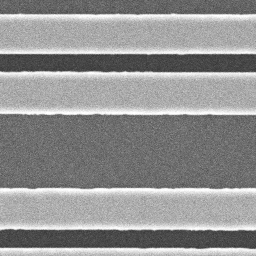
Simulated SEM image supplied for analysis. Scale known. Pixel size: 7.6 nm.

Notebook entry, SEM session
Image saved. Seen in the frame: lines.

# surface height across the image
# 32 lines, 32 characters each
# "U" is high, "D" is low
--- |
DDDDDDDDDDDDDDDDDDDDDDDDDDDDDDDD
DDDDDDDDDDDDDDDDDDDDDDDDDDDDDDDD
UUUUUUUUUUUUUUUUUUUUUUUUUUUUUUUU
UUUUUUUUUUUUUUUUUUUUUUUUUUUUUUUU
UUUUUUUUUUUUUUUUUUUUUUUUUUUUUUUU
UUUUUUUUUUUUUUUUUUUUUUUUUUUUUUUU
UUUUUUUUUUUUUUUUUUUUUUUUUUUUUUUU
DDDDDDDDDDDDDDDDDDDDDDDDDDDDDDDD
DDDDDDDDDDDDDDDDDDDDDDDDDDDDDDDD
UUUUUUUUUUUUUUUUUUUUUUUUUUUUUUUU
UUUUUUUUUUUUUUUUUUUUUUUUUUUUUUUU
UUUUUUUUUUUUUUUUUUUUUUUUUUUUUUUU
UUUUUUUUUUUUUUUUUUUUUUUUUUUUUUUU
UUUUUUUUUUUUUUUUUUUUUUUUUUUUUUUU
DDDDDDDDDDDDDDDDDDDDDDDDDDDDDDDD
DDDDDDDDDDDDDDDDDDDDDDDDDDDDDDDD
DDDDDDDDDDDDDDDDDDDDDDDDDDDDDDDD
DDDDDDDDDDDDDDDDDDDDDDDDDDDDDDDD
DDDDDDDDDDDDDDDDDDDDDDDDDDDDDDDD
DDDDDDDDDDDDDDDDDDDDDDDDDDDDDDDD
DDDDDDDDDDDDDDDDDDDDDDDDDDDDDDDD
DDDDDDDDDDDDDDDDDDDDDDDDDDDDDDDD
DDDDDDDDDDDDDDDDDDDDDDDDDDDDDDDD
DDDDDDDDDDDDDDDDDDDDDDDDDDDDDDDD
UUUUUUUUUUUUUUUUUUUUUUUUUUUUUUUU
UUUUUUUUUUUUUUUUUUUUUUUUUUUUUUUU
UUUUUUUUUUUUUUUUUUUUUUUUUUUUUUUU
UUUUUUUUUUUUUUUUUUUUUUUUUUUUUUUU
UUUUUUUUUUUUUUUUUUUUUUUUUUUUUUUU
DDDDDDDDDDDDDDDDDDDDDDDDDDDDDDDD
DDDDDDDDDDDDDDDDDDDDDDDDDDDDDDDD
UUUUUUUUUUUUUUUUUUUUUUUUUUUUUUUU